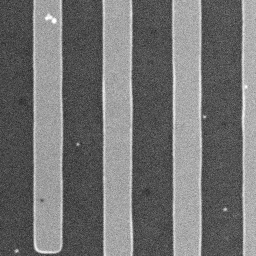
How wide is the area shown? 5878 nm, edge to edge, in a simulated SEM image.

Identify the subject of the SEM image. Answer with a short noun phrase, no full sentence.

groups of lines, slits or small figures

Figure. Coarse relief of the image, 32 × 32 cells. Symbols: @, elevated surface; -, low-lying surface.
----@@@@-----@@@------@@@-----@@
----@@@@-----@@@------@@@-----@@
----@@@@-----@@@------@@@-----@@
----@@@@-----@@@------@@@-----@@
----@@@@-----@@@------@@@-----@@
----@@@@-----@@@------@@@-----@@
----@@@@-----@@@------@@@-----@@
----@@@@-----@@@------@@@-----@@
----@@@@-----@@@------@@@-----@@
----@@@@-----@@@------@@@-----@@
----@@@@-----@@@------@@@-----@@
----@@@@-----@@@------@@@-----@@
----@@@@-----@@@------@@@------@
----@@@@-----@@@------@@@------@
----@@@@-----@@@------@@@-----@@
----@@@@-----@@@------@@@-----@@
----@@@@-----@@@------@@@-----@@
----@@@@-----@@@------@@@-----@@
----@@@@-----@@@------@@@-----@@
----@@@@-----@@@------@@@-----@@
----@@@@-----@@@------@@@-----@@
----@@@@-----@@@------@@@-----@@
----@@@@-----@@@------@@@------@
----@@@@-----@@@------@@@-----@@
----@@@@-----@@@------@@@-----@@
----@@@@-----@@@------@@@-----@@
----@@@@-----@@@------@@@------@
----@@@@-----@@@------@@@------@
----@@@@-----@@@------@@@------@
----@@@@-----@@@------@@@------@
----@@@@-----@@@------@@@------@
-----@@------@@@------@@@------@